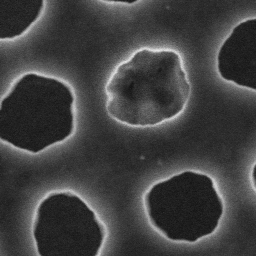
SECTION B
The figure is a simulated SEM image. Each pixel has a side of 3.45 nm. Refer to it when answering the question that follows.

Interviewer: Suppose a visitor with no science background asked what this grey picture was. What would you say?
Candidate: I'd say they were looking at holes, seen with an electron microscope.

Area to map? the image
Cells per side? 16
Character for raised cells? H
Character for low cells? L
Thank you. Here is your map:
LLLHHHHHHHHHHHHH
LLHHHHHHHHHHHHHL
HHHHHHHHHHHHHHLL
HHHHHHHHHHHHHHLL
HHHHHHHHHHHHHHLL
HLLLHHHHHHHHHHHH
LLLLHHHHHHHHHHHH
LLLLLHHHHHHHHHHH
LLLLHHHHHHHHHHHH
HHHHHHHHHHHHHHHH
HHHHHHHHHHHHHHHH
HHHHHHHHHHLLLHHH
HHHLLHHHHLLLLLHH
HHLLLLHHHLLLLLHH
HHLLLLHHHHLLLHHH
HHLLLLHHHHHHHHHH